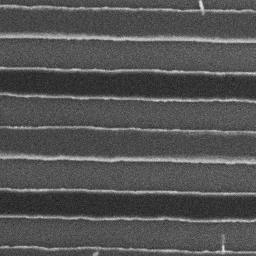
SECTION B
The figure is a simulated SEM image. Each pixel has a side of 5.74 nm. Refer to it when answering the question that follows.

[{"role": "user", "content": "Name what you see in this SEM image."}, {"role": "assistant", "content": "lines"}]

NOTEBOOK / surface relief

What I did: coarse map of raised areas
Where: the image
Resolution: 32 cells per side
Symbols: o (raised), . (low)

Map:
................................
oooooooooooooooooooooooooooooooo
oooooooooooooooooooooooooooooooo
oooooooooooooooooooooooooooooooo
oooooooooooooooooooooooooooooooo
................................
................................
................................
o...............................
oooooooooooooooooooooooooooooooo
oooooooooooooooooooooooooooooooo
oooooooooooooooooooooooooooooooo
...................ooooooooooooo
................................
................................
................................
oooooooooooooooooooooooooooooooo
oooooooooooooooooooooooooooooooo
oooooooooooooooooooooooooooooooo
oo.ooooooooooooooooooooooooooooo
................................
................................
................................
................................
oooooooooooooooooooooooooooooooo
oooooooooooooooooooooooooooooooo
oooooooooooooooooooooooooooooooo
......................oooooooooo
................................
................................
................................
oooooooooooooooooooooooo.o.oo...